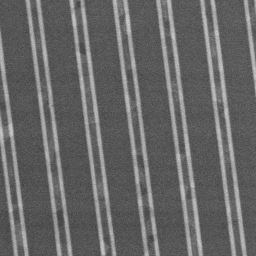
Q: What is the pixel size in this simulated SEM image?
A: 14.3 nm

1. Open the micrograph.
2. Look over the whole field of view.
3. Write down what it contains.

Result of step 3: parallel lines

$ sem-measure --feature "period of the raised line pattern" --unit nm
618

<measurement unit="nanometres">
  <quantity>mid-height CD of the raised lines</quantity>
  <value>140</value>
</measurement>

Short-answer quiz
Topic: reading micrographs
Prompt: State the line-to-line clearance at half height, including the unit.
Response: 468 nm